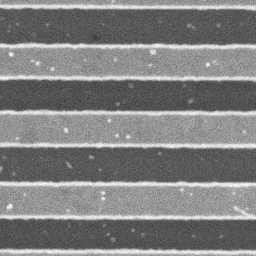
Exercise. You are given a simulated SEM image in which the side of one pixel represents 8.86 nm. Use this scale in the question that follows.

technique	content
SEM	lines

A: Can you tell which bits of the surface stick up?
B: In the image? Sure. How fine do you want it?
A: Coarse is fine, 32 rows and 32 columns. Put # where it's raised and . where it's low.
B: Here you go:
################################
................................
................................
................................
................................
................................
################################
################################
################################
################################
................................
................................
................................
................................
################################
################################
################################
################################
................................
................................
................................
................................
................................
################################
################################
################################
################################
................................
................................
................................
................................
################################